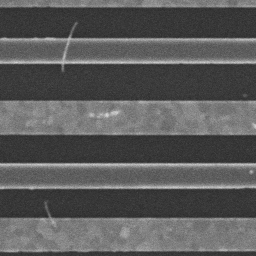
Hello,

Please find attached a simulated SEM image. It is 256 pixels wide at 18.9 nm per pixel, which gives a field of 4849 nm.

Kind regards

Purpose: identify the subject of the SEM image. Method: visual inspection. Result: lines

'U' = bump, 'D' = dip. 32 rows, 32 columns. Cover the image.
UUUUUUUUUUUUUUUUUUUUUUUUUUUUUUUU
DDDDDDDDDDDDDDDDDDDDDDDDDDDDDDDD
DDDDDDDDDDDDDDDDDDDDDDDDDDDDDDDD
DDDDDDDDDDDDDDDDDDDDDDDDDDDDDDDD
DDDDDDDDDDDDDDDDDDDDDDDDDDDDDDDD
UUUUUUUUUUUUUUUUUUUUUUUUUUUUUUUU
UUUUUUUUUUUUUUUUUUUUUUUUUUUUUUUU
UUUUUUUUUUUUUUUUUUUUUUUUUUUUUUUU
DDDDDDDDDDDDDDDDDDDDDDDDDDDDDDDD
DDDDDDDDDDDDDDDDDDDDDDDDDDDDDDDD
DDDDDDDDDDDDDDDDDDDDDDDDDDDDDDDD
DDDDDDDDDDDDDDDDDDDDDDDDDDDDDDDD
DDDDDDDDDDDDDDDDDDDDDDDDDDDDDDDD
UUUUUUUUUUUUUUUUUUUUUUUUUUUUUUUU
UUUUUUUUUUUUUUUUUUUUUUUUUUUUUUUU
UUUUUUUUUUUUUUUUUUUUUUUUUUUUUUUU
UUUUUUUUUUUUUUUUUUUUUUUUUUUUUUUU
DDDDDDDDDDDDDDDDDDDDDDDDDDDDDDDD
DDDDDDDDDDDDDDDDDDDDDDDDDDDDDDDD
DDDDDDDDDDDDDDDDDDDDDDDDDDDDDDDD
UUUUUUUUUUUUUUUUUUUUUUUUUUUUUUUU
UUUUUUUUUUUUUUUUUUUUUUUUUUUUUUUU
UUUUUUUUUUUUUUUUUUUUUUUUUUUUUUUU
UUUUUUUUUUUUUUUUUUUUUUUUUUUUUUUU
DDDDDDDDDDDDDDDDDDDDDDDDDDDDDDDD
DDDDDDDDDDDDDDDDDDDDDDDDDDDDDDDD
DDDDDDDDDDDDDDDDDDDDDDDDDDDDDDDD
UUUUUUUUUUUUUUUUUUUUUUUUUUUUUUUU
UUUUUUUUUUUUUUUUUUUUUUUUUUUUUUUU
UUUUUUUUUUUUUUUUUUUUUUUUUUUUUUUU
UUUUUUUUUUUUUUUUUUUUUUUUUUUUUUUU
DDDDDDDDDDDDDDDDDDDDDDDDDDDDDDDD